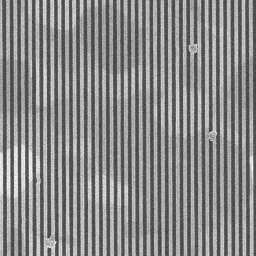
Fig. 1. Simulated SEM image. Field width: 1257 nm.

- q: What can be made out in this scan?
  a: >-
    parallel lines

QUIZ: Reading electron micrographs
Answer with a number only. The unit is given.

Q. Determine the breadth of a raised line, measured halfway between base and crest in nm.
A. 16.6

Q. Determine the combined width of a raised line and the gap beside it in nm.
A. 36.1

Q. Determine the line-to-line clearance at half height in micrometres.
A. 0.0209